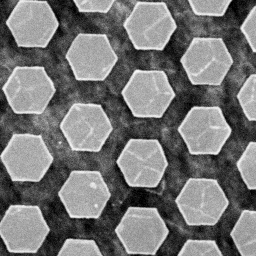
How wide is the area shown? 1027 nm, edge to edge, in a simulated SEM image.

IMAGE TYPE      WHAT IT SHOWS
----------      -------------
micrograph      a regular array of raised bodies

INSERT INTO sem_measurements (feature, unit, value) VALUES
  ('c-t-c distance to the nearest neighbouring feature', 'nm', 268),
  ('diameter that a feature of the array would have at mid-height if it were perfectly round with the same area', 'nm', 193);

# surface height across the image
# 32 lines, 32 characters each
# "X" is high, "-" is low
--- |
--XXXX----XXXX---XXX----XXXXX---
--XXXXX----------XXXX---XXXX---X
-XXXXXX---------XXXXXX---------X
-XXXXXX---------XXXXXX--------XX
--XXXXX---XXX---XXXXX----------X
--XXXX---XXXXX---XXXX---XXXX---X
--------XXXXXX---------XXXXXX---
---------XXXXXX--------XXXXXX---
--XXX----XXXXX---------XXXXXX---
-XXXXX---XXXX----XXXX---XXXX----
-XXXXXX---------XXXXX-----X----X
-XXXXXX--------XXXXXXX--------XX
-XXXXX----------XXXXX---------XX
-XXXXX---XXXX---XXXXX---XXX---XX
--------XXXXX----XXX---XXXXX---X
--------XXXXXX---------XXXXX----
--------XXXXXX---------XXXXXX---
-XXXX---XXXXX----XX----XXXXX----
-XXXXX---XXX----XXXX----XXXX---X
XXXXXX---------XXXXXX---------XX
-XXXXX---------XXXXXX---------XX
-XXXXX---XXX---XXXXX----------XX
--XXX---XXXXX---XXXX----XXX---XX
--------XXXXX----------XXXXX---X
-------XXXXXXX--------XXXXXX----
--------XXXXX---------XXXXXX----
-XXXX----XXXX---XXXX---XXXXX--XX
XXXXX----------XXXXX---XXXX---XX
XXXXXX---------XXXXXX--------XXX
XXXXXX---------XXXXXX--------XXX
-XXXX---XXXX---XXXXX---XXXX--XXX
--X----XXXXX----XXX----XXXX---XX